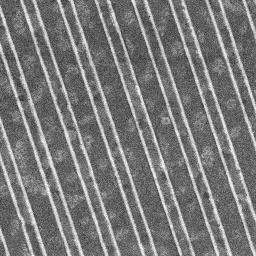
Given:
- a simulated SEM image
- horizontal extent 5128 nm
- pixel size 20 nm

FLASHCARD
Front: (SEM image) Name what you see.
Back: parallel lines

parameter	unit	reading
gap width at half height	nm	463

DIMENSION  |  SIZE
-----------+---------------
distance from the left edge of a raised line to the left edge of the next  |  0.704 µm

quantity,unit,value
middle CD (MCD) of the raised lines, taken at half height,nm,240